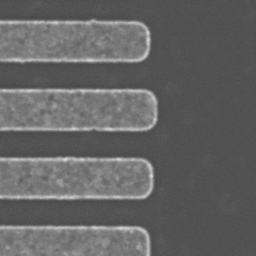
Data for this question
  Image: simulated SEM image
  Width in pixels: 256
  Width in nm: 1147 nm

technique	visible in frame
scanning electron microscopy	one or a few lines or trenches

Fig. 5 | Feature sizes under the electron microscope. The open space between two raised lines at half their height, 0.135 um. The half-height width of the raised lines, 171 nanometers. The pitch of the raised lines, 307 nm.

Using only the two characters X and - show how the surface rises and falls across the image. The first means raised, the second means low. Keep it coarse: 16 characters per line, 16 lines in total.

----------------
XXXXXXXXX-------
XXXXXXXXX-------
XXXXXXXXX-------
----------------
----------------
XXXXXXXXXX------
XXXXXXXXXX------
----------------
----------------
XXXXXXXXX-------
XXXXXXXXX-------
----------------
----------------
XXXXXXXXX-------
XXXXXXXXX-------